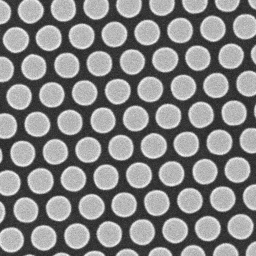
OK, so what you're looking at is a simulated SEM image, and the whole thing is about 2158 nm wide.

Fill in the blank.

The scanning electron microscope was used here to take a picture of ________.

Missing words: an array of small figures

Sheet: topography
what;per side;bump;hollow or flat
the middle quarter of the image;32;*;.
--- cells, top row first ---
****..******..******...*****...*
****..*****....****.....***.....
***....***......**..............
....................***.....****
....**.....*****...*****...*****
...*****...*****...******..*****
..******..******..*******..*****
..******..******...*****...*****
..******...*****...*****....***.
...****.....***.................
........................****....
........****....****...******..*
****...*****...******..******..*
****...******..******..******..*
****...******..******..******...
****...******..*****....****....
****....****.....**.............
.*....................*......***
.....**.....****....*****...****
....****....*****..******...****
...******..******..******...****
*..******..******...*****...****
*..******...*****...*****....***
*...****....****.....*..........
................................
.........***.....****....****...
****....*****...******..******..
*****...*****...******..******..
*****...*****...******..******..
*****...*****...*****....****...
*****...*****....***............
.***..........................**